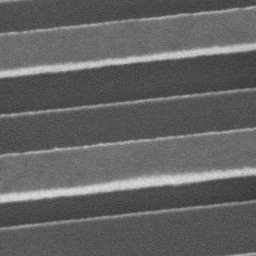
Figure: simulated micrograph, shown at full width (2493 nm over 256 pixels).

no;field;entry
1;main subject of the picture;lines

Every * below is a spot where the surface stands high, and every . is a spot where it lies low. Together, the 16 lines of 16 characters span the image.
...............*
......**********
****************
***********.....
**..............
................
................
................
...........*****
..**************
****************
**********......
................
................
................
................